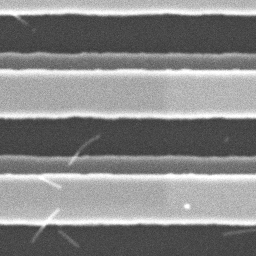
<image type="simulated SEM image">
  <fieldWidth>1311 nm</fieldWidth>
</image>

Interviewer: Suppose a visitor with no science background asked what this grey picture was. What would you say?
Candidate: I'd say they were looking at lines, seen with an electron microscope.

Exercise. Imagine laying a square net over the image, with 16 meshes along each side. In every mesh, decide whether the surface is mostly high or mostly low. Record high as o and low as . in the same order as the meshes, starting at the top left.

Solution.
oooooooooooooooo
................
................
oooooooooooooooo
oooooooooooooooo
oooooooooooooooo
oooooooooooooooo
................
................
................
oooooooooooooooo
oooooooooooooooo
oooooooooooooooo
oooooooooooooooo
................
................